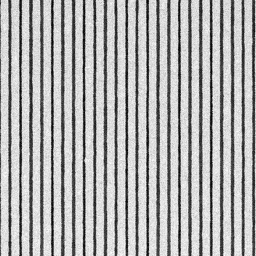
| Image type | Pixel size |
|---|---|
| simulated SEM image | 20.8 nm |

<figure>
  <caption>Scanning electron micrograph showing parallel lines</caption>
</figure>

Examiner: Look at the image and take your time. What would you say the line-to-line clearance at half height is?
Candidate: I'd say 75.3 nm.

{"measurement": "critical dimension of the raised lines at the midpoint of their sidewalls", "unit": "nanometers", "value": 151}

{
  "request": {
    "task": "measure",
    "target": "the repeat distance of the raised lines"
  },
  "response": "220 nm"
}